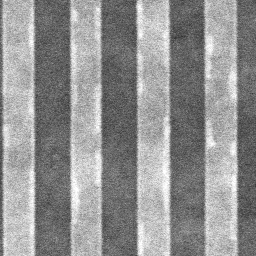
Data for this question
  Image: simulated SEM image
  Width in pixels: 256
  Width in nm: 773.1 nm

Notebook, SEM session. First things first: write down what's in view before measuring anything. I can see one or a few lines or trenches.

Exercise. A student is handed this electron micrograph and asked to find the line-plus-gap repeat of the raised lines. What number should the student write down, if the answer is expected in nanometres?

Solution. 204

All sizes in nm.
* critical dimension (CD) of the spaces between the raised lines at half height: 114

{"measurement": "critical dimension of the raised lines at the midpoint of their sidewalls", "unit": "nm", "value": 89.7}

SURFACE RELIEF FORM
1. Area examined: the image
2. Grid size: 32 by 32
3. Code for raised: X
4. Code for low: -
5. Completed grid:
XXXX-----XXX-----XXXX-----XXX---
XXXX-----XXX-----XXXX-----XXX---
XXXX-----XXX-----XXXX-----XXX---
XXXX-----XXX-----XXXX-----XXX---
XXXX-----XXXX----XXXX-----XXX---
XXXX-----XXXX----XXXX-----XXX---
XXXX-----XXXX----XXXX-----XXX---
XXXX-----XXXX----XXXX-----XXX---
XXXX-----XXXX----XXXX-----XXX---
XXXX-----XXXX----XXXX-----XXXX--
XXXX-----XXXX----XXXX-----XXXX--
XXXX-----XXXX----XXXX-----XXXX--
XXXX-----XXXX----XXXX-----XXXX--
XXXX-----XXXX----XXXX-----XXX---
XXXX-----XXX-----XXXX-----XXX---
-XXX-----XXX-----XXXX-----XXX---
-XXX-----XXX-----XXXX-----XXX---
-XXX-----XXXX----XXXX-----XXX---
-XXX-----XXXX----XXXX-----XXX---
-XXX-----XXXX----XXXX-----XXX---
-XXX-----XXXX----XXXX-----XXX---
-XXX-----XXXX----XXXX-----XXX---
-XXX-----XXXX----XXXX-----XXX---
-XXX-----XXXX----XXXX-----XXX---
-XXX-----XXXX----XXXX-----XXX---
-XXX-----XXXX----XXXX-----XXX---
-XXX-----XXXX----XXXX-----XXX---
-XXX-----XXXX----XXXX-----XXX---
-XXX-----XXXX----XXXX-----XXX---
-XXX-----XXXX----XXXX-----XXX---
-XXX-----XXXX----XXXX-----XXX---
-XXX-----XXXX----XXXX-----XXX---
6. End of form